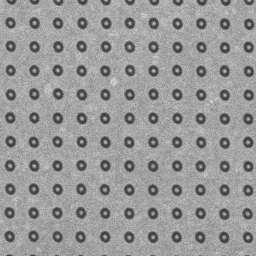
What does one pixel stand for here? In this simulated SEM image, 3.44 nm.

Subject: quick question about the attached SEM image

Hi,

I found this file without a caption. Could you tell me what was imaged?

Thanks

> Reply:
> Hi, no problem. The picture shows a regular array of ring-shaped grooves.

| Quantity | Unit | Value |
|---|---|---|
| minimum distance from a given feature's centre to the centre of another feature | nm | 80.4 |